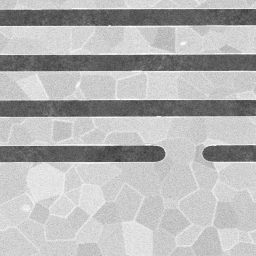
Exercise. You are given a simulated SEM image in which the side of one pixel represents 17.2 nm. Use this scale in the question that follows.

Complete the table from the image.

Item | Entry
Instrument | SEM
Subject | groups of lines, slits or small figures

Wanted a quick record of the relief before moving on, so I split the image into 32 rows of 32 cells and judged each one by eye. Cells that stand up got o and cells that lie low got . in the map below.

oooooooooooooooooooooooooooooooo
................................
................................
oooooooooooooooooooooooooooooooo
oooooooooooooooooooooooooooooooo
oooooooooooooooooooooooooooooooo
oooooooooooooooooooooooooooooooo
................................
................................
oooooooooooooooooooooooooooooooo
oooooooooooooooooooooooooooooooo
oooooooooooooooooooooooooooooooo
................................
................................
................................
oooooooooooooooooooooooooooooooo
oooooooooooooooooooooooooooooooo
oooooooooooooooooooooooooooooooo
....................oooooo......
.....................oooo.......
oooooooooooooooooooooooooooooooo
oooooooooooooooooooooooooooooooo
oooooooooooooooooooooooooooooooo
oooooooooooooooooooooooooooooooo
oooooooooooooooooooooooooooooooo
oooooooooooooooooooooooooooooooo
oooooooooooooooooooooooooooooooo
oooooooooooooooooooooooooooooooo
oooooooooooooooooooooooooooooooo
oooooooooooooooooooooooooooooooo
oooooooooooooooooooooooooooooooo
oooooooooooooooooooooooooooooooo